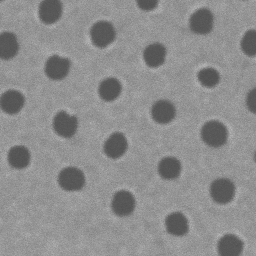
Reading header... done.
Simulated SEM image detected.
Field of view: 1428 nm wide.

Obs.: a regular array of holes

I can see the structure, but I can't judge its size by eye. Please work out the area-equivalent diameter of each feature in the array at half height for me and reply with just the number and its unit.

25.2 pixels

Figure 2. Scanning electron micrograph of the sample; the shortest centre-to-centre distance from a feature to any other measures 314 nanometres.